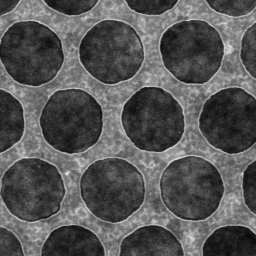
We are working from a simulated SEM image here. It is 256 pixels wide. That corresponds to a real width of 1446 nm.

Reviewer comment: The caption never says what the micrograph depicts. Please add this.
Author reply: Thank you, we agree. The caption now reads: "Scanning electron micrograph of holes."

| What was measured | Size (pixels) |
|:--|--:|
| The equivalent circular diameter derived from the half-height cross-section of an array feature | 63.6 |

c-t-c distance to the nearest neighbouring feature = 444 nm